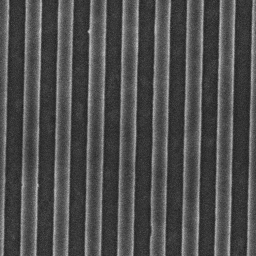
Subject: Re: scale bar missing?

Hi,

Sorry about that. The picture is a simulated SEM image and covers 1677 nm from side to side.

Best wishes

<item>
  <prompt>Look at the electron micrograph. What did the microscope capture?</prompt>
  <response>parallel lines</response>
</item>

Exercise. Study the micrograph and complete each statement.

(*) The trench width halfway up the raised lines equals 0.112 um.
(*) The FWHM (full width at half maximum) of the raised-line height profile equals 15.5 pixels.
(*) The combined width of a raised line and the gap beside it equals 212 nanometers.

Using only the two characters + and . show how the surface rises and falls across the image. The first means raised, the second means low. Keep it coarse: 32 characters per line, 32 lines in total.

+..++..++..++..++...+..++...+...
+..++..++..++..++..++..++...+...
+..++..++..++..++..++..++...+...
+..++..++..++..++..++..++...+...
+..++..++..++..++..++..++..++...
+..++..++..++..++..++..++..++...
+..++..++..++..++..++..++..++...
+..++..++..++..++..++..++..++...
+..++..++..++..++..++..++..++..+
+..++..++..++..++..++..++..++..+
+..++..++..++..++..++..++..++..+
+..++..++..++..++..++..++..++..+
+..++..++..++..++..++..++..++..+
+..++..++..++..++..++..++..++..+
+..++..++..++..++..++..++..++..+
+..++..++..++..++..++..++..++..+
+..++..++..++..++..++..++..++..+
+..++..++..++..++..++..++..++..+
+..++..++..++..++..++..++..++..+
+..++..++..++..++..++..++..++..+
+..++..++..++..++..++..++..++..+
+..++..++..++..++..++..++..++..+
+..++..++..++..++..++..++..++..+
+..++..++..++..++..++..++..++..+
+..++..++..++..++..++..++..++..+
...++..++..++..++..++..++..++..+
...++..++..++..++..++..++..++..+
...++..++..++..++..++..++..++..+
...++..+...++..++..++..++..++..+
...+...+...++..++..++..++..++..+
...+...+...++..++..++..++..++..+
...+...+...++..++..++..++..++..+